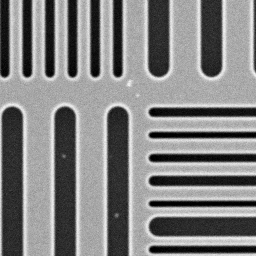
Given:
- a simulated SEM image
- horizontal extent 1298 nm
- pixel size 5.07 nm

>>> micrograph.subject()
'groups of lines, slits or small figures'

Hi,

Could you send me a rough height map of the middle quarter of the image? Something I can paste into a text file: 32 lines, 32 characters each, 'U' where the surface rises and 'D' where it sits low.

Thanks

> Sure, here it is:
UDDUUUDDDUUUDDDUUUUUUDDDDDUUUUUU
UDDUUUDDDUUUDDDUUUUUUDDDDDUUUUUU
UDDUUUUDDUUUDDDUUUUUUUDDDDUUUUUU
UUUUUUUUUUUUUDUUUUUUUUUDUUUUUUUU
UUUUUUUUUUUUUUUUUUUUUUUUUUUUUUUU
UUUUUUUUUUUUUUUUUUUUUUUUUUUUUUUU
UUUUUUUUUUUUUUUUUUUUUUUUUUUUUUUU
UUUUUUUUUUUUUUUUUUUUUUUUUUUUUUUU
UUUUUUUUUUUUUUUUUUUUUUUUUUUUUUUU
UUUUUUUUUUUUUUUUUUUUUUUUUUUUUUUU
UUUUUUUUUUUUUDUUUUUUUUUUUUUUUUUU
DDUUUUUUUUUDDDDDUUUUUDDDDDDDDDDD
DDDUUUUUUUUDDDDDUUUUUDDDDDDDDDDD
DDDUUUUUUUUDDDDDUUUUUUUUUUUUUUUU
DDDUUUUUUUUDDDDDUUUUUUUUUUUUUUUU
DDDUUUUUUUUDDDDDUUUUUUUUUUUUUUUU
DDDUUUUUUUUDDDDDUUUUUUUUUUUUUUUU
DDDUUUUUUUUDDDDDUUUUUDDDDDDDDDDD
DDDUUUUUUUUDDDDDUUUUUUDDDDDDDDDD
DDDUUUUUUUUDDDDDUUUUUUUUUUUUUUUU
DDDUUUUUUUUDDDDDUUUUUUUUUUUUUUUU
DDDUUUUUUUUDDDDDUUUUUUUUUUUUUUUU
DDDUUUUUUUUDDDDDUUUUUUDDDDDDDDDD
DDDUUUUUUUUDDDDDUUUUUDDDDDDDDDDD
DDDUUUUUUUUDDDDDUUUUUUDDDDDDDDDD
DDDUUUUUUUUDDDDDUUUUUUUUUUUUUUUU
DDDUUUUUUUUDDDDDUUUUUUUUUUUUUUUU
DDDUUUUUUUUDDDDDUUUUUUUUUUUUUUUU
DDDUUUUUUUUDDDDDUUUUUDDDDDDDDDDD
DDDUUUUUUUUDDDDDUUUUUDDDDDDDDDDD
DDDUUUUUUUUDDDDDUUUUUUDDDDDDDDDD
DDDUUUUUUUUDDDDDUUUUUUUUUUUUUUUU